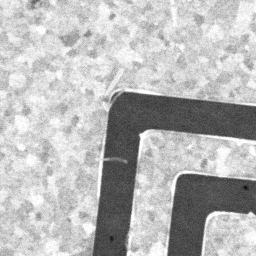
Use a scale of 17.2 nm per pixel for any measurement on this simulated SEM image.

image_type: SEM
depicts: groups of lines, slits or small figures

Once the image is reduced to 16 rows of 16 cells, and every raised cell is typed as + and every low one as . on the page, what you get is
++++++++++++++++
++++++++++++++++
++++++++++++++++
++++++++++++++++
++++++++++++++++
++++++++++++++++
+++++++........+
+++++++.........
+++++++..++++...
++++++...+++++++
++++++...+++++++
++++++..+++.....
++++++..+++.....
++++++..+++..+++
++++++..+++..+++
++++++..++...+++